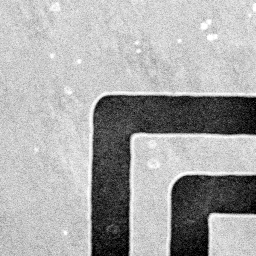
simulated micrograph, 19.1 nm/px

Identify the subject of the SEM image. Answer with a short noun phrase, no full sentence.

groups of lines, slits or small figures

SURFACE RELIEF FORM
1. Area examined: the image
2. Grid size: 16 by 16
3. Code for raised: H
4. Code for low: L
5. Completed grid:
HHHHHHHHHHHHHHHH
HHHHHHHHHHHHHHHH
HHHHHHHHHHHHHHHH
HHHHHHHHHHHHHHHH
HHHHHHHHHHHHHHHH
HHHHHHHHHHHHHHHH
HHHHHHLLLLLLLLLL
HHHHHHLLLLLLLLLL
HHHHHHLLLHHHHHHH
HHHHHHLLHHHHHHHH
HHHHHHLLHHHHHHHH
HHHHHHLLHHHLLLLL
HHHHHHLLHHHLLLLL
HHHHHHLLHHHLLHHH
HHHHHHLLHHHLLHHH
HHHHHHLLHHHLLHHH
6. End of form